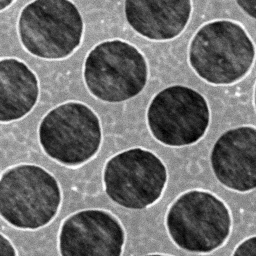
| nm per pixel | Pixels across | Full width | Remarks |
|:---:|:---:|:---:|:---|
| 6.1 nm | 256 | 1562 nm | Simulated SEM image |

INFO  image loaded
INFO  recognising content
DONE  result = holes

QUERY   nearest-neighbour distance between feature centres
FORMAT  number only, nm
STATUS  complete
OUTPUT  466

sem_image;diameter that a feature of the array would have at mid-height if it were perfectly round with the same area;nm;375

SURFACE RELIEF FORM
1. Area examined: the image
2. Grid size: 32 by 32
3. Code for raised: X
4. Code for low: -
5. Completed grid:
-XXX-----XXXXXXX--------XXXXXX--
XXX-------XXXXXX--------XXXXXXX-
XX--------XXXXXX--------XXXXXXXX
XX--------XXXXXXX------XX-----XX
XX--------XXXXXXXX----XX-------X
XXX-------XX----XXXXXXXX--------
XXXX-----XX------XXXXXXX--------
--XXXXXXXXX-------XXXXXX--------
---XXXXXXXX-------XXXXXX-------X
----XXXXXXX-------XXXXXXX-----XX
-----XXXXXX-------XXXXXXXXXXXXXX
-----XXXXXX-------XX----XXXXXXXX
-----XXXXXXXX---XXX-------XXXXXX
----XXX----XXXXXXXX-------XXXXXX
---XXX------XXXXXX--------XXXXXX
XXXXX-------XXXXXXX-------XXXXXX
XXXXX--------XXXXXX-------XX----
XXXXX--------XXXXXXX-----XX-----
XXXXX-------XXXXXXXXXXXXXXX-----
XXXXXX-----XXX-----XXXXXXX------
XXXXXXXX--XXX-------XXXXXX------
X-----XXXXXXX--------XXXXXX-----
-------XXXXXX--------XXXXXX-----
-------XXXXXX-------XXXXXXXXX---
--------XXXXXX------XXX----XXXXX
-------XXXXXXXX----XXX------XXXX
-------XXX---XXXXXXXX--------XXX
X-----XX------XXXXXXX--------XXX
XXX--XXX-------XXXXXX--------XXX
XXXXXXXX-------XXXXXX-------XXXX
-XXXXXX--------XXXXXXX------XX--
--XXXXXX-------XXXXXXXXX--XXX---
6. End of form